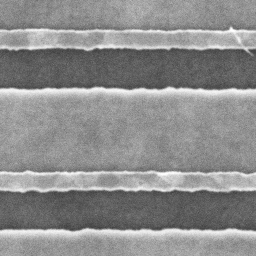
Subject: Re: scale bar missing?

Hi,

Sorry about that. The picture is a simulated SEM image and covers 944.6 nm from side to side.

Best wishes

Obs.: lines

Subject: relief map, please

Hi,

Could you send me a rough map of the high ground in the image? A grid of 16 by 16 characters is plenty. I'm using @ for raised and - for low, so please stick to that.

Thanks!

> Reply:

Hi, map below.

@@@@@@@@@@@@@@@@
@@@@@@@@@@@@@@@@
@@@@@@@@@@@@@@@@
----------------
----------------
----------------
@@@@@@@@@@@@@@@@
@@@@@@@@@@@@@@@@
@@@@@@@@@@@@@@@@
@@@@@@@@@@@@@@@@
@@@@@@@@@@@@@@@@
@@@@@@@@@@@@@@@@
----------------
----------------
@@@@@@@@@@@@@@@@
@@@@@@@@@@@@@@@@